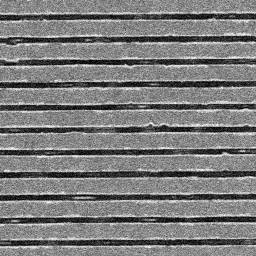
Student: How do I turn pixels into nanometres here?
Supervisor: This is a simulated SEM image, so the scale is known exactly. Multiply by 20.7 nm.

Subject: parallel lines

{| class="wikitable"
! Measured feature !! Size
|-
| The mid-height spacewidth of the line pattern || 0.132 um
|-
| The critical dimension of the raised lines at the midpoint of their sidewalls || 341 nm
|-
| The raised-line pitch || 466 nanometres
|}